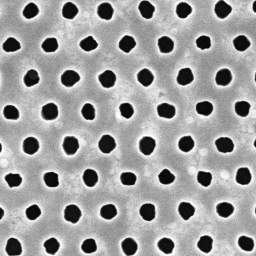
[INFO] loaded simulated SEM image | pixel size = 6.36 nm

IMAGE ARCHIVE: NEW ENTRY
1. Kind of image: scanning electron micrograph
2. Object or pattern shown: a regular array of holes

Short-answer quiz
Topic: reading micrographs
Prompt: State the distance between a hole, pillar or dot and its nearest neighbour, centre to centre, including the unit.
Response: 0.237 micrometres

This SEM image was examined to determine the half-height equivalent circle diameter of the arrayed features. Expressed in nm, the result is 104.